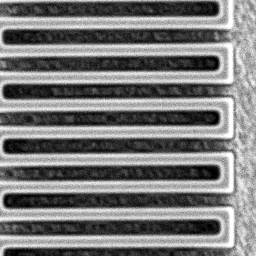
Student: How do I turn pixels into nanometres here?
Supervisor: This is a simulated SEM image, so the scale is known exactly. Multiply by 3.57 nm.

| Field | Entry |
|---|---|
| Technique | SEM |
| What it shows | groups of lines, slits or small figures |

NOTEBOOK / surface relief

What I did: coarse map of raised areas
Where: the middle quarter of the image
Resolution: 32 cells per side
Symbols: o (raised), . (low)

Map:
................................
................................
oooooooooooooooooooooooooooooooo
oooooooooooooooooooooooooooooooo
oooooooooooooooooooooooooooooooo
................................
................................
................................
................................
oooooooooooooooooooooooooooooooo
oooooooooooooooooooooooooooooooo
oooooooooooooooooooooooooooooooo
................................
................................
................................
.....................ooooooooooo
oooooooooooooooooooooooooooooooo
oooooooooooooooooooooooooooooooo
................................
................................
................................
................................
....................oooooooooooo
oooooooooooooooooooooooooooooooo
oooooooooooooooooooooooooooooooo
................................
................................
................................
................................
oooooooooooooooooooooooooooooooo
oooooooooooooooooooooooooooooooo
oooooooooooooooooooooooooooooooo